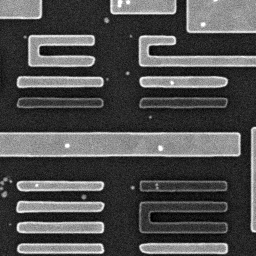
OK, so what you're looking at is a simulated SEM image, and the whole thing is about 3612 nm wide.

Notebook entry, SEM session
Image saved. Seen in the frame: wiring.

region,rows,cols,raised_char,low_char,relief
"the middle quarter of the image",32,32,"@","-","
--------------------------------
--------------------------------
--------------------------------
@@@@@@@@@----------@@@@@@@@@@@@@
@@@@@@@@@@---------@@@@@@@@@@@@@
@@@@@@@@@-----------@@@@@@@@@@@@
--------------------------------
--------------------------------
--------------------------------
@@@@@@@@@@---------@@@@@@@@@@@@@
@@@@@@@@@----------@@@@@@@@@@@@@
--------------------------------
--------------------------------
--------------------------------
--------------------------------
--------------------------------
--------------------------------
@@@@@@@@@@@@@@@@@@@@@@@@@@@@@@@@
@@@@@@@@@@@@@@@@@@@@@@@@@@@@@@@@
@@@@@@@@@@@@@@@@@@@@@@@@@@@@@@@@
@@@@@@@@@@@@@@@@@@@@@@@@@@@@@@@@
@@@@@@@@@@@@@@@@@@@@@@@@@@@@@@@@
@@@@@@@@@@@@@@@@@@@@@@@@@@@@@@@@
--------------------------------
--------------------------------
--------------------------------
--------------------------------
--------------------------------
--------------------------------
@------------------@@@@@@@@@@@@@
@@@@@@@@@@---------@@@@@@@@@@@@@
@@@@@@@@@----------@@@@@@@@@@@@@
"